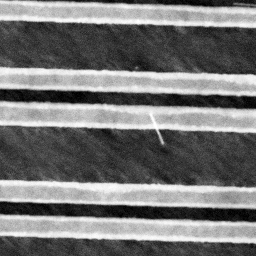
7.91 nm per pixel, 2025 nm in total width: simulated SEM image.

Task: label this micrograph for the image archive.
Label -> lines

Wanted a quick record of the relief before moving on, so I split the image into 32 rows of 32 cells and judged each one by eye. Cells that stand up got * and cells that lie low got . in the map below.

*************...................
********************************
....****************************
................................
................................
................................
................................
................................
................................
***************************.....
********************************
..................**************
................................
*******************...**........
********************************
.*******************************
...............................*
................................
................................
................................
................................
................................
................................
***************************.....
********************************
............********************
................................
*******************.............
********************************
...*****************************
................................
................................